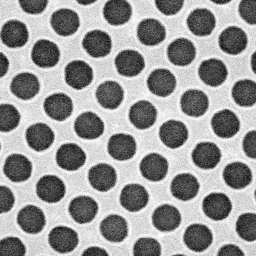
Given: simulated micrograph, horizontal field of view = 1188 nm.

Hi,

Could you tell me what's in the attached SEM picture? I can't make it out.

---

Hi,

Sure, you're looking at a regular array of holes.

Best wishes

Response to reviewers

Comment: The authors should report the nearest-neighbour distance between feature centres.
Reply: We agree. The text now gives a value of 168 nm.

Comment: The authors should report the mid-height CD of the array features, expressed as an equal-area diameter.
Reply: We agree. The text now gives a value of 30.4 pixels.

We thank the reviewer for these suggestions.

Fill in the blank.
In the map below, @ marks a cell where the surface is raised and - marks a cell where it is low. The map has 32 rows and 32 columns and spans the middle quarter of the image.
-------@@@@@@-------@@@@@@@@---@
-------@@@@@@-------@@----@@@@@@
--------@@@@@@-----@@-------@@@@
-------@@@@@@@@@@@@@@-------@@@@
-------@@-----@@@@@@@-------@@@@
@-----@@-------@@@@@@-------@@@@
@@@-@@@@-------@@@@@@-------@@--
-@@@@@@@-------@@@@@@@-----@@---
--@@@@@@-------@@@@@@@@@-@@@@---
--@@@@@@-------@@@----@@@@@@@---
---@@@@@@-----@@@------@@@@@@---
--@@@@@@@@@--@@@-------@@@@@@---
--@@----@@@@@@@@--------@@@@@@--
-@@------@@@@@@@-------@@@@@@@@@
@@--------@@@@@@-------@@-----@@
@@--------@@@@@@@-----@@-------@
@@--------@@@@@@@@@-@@@@-------@
@@@-------@@----@@@@@@@--------@
@@@@----@@@-------@@@@@@-------@
@@@@@@@@@@@-------@@@@@@-------@
----@@@@@@@-------@@@@@@@----@@@
-----@@@@@@-------@@@@@@@@@-@@@@
------@@@@@-------@@@---@@@@@@@@
------@@@@@@-----@@@------@@@@@@
-----@@@@@@@@@@@@@@-------@@@@@@
-----@@-----@@@@@@@-------@@@@@@
----@@-------@@@@@@-------@@@@@@
@@@@@@-------@@@@@@-------@@----
@@@@@@-------@@@@@@@-----@@-----
@@@@@@-------@@@@@@@@---@@@-----
@@@@@@@------@@-----@@@@@@------
-@@@@@@@----@@-------@@@@@------